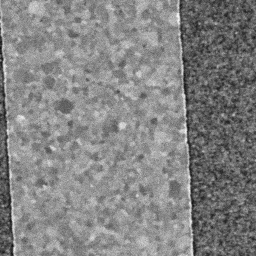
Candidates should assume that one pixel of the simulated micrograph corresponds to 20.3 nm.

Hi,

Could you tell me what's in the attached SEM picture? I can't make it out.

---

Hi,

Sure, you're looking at one or a few lines or trenches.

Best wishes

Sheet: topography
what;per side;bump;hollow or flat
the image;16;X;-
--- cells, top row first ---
XXXXXXXXXXX-----
XXXXXXXXXXX-----
XXXXXXXXXXX-----
XXXXXXXXXXX-----
XXXXXXXXXXX-----
XXXXXXXXXXX-----
XXXXXXXXXXXX----
XXXXXXXXXXXX----
XXXXXXXXXXXX----
-XXXXXXXXXXX----
-XXXXXXXXXXX----
-XXXXXXXXXXX----
-XXXXXXXXXXX----
-XXXXXXXXXXX----
-XXXXXXXXXXX----
-XXXXXXXXXXX----